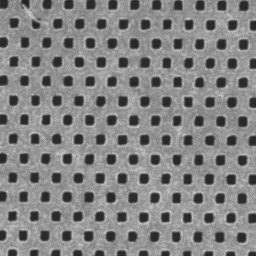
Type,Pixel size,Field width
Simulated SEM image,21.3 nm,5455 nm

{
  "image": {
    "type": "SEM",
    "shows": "a regular array of holes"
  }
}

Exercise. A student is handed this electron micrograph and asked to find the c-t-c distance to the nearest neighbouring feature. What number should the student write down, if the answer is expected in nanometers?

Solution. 463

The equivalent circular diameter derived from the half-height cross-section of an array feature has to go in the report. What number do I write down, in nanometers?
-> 240